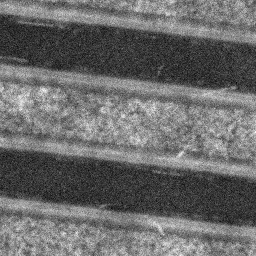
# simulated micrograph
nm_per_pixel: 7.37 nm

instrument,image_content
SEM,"one or a few lines or trenches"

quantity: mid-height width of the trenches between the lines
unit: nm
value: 441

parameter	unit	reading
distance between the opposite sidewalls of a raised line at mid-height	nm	535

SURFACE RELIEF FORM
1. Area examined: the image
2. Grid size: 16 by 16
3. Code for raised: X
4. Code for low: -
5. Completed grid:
XXXXXXXXXXXXXXXX
--------XXXXXXXX
----------------
----------------
XX--------------
XXXXXXXXXX------
XXXXXXXXXXXXXXXX
XXXXXXXXXXXXXXXX
XXXXXXXXXXXXXXXX
-----XXXXXXXXXXX
-------------XXX
----------------
----------------
XXXXXXX---------
XXXXXXXXXXXXXXX-
XXXXXXXXXXXXXXXX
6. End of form